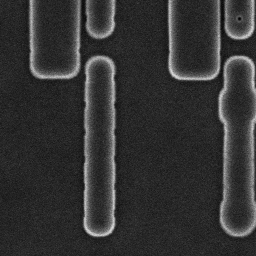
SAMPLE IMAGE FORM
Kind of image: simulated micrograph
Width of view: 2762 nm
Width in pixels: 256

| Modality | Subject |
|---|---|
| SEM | wiring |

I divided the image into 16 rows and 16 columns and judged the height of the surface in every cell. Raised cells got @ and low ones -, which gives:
--@@@@@----@@@@@
--@@@@@----@@@@@
--@@@------@@@--
--@@@------@@@--
--@@@@@----@@@@@
-----@@-------@@
-----@@-------@@
-----@@-------@@
-----@@-------@@
-----@@-------@@
-----@@-------@@
-----@@-------@@
-----@@-------@@
-----@@-------@@
------@-------@-
----------------